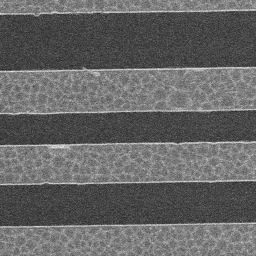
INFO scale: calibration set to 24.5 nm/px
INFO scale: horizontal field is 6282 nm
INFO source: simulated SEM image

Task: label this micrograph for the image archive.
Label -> one or a few lines or trenches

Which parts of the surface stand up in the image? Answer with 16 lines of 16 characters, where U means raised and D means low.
UUUUUUUUUUUUUUUU
DDDDDDDDDDDDDDDD
DDDDDDDDDDDDDDDD
DDDDDDDDDDDDDDDD
UUUUUUUUUUUUUUUU
UUUUUUUUUUUUUUUU
UUUUUUUUUUUUUUUU
DDDDDDDDDDDDDDDD
DDDDDDDDDDDDDDDD
UUUUUUUUUUUUUUUU
UUUUUUUUUUUUUUUU
DDDDDDDDDDDDDDDD
DDDDDDDDDDDDDDDD
DDDDDDDDDDDDDDDD
UUUUUUUUUUUUUUUU
UUUUUUUUUUUUUUUU